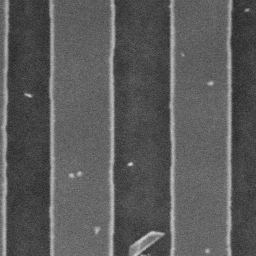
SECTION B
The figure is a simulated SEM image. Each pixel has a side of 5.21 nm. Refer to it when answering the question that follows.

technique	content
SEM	lines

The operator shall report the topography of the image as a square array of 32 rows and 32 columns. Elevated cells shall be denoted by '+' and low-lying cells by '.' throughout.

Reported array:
+.....++++++++.......++++++++...
+.....++++++++.......++++++++...
+.....++++++++.......++++++++...
+.....++++++++.......++++++++...
+.....++++++++.......++++++++...
+.....++++++++.......++++++++...
+.....++++++++.......++++++++...
+.....++++++++.......++++++++...
+.....++++++++.......++++++++...
+.....++++++++.......++++++++...
+.....++++++++.......++++++++...
+.....++++++++.......++++++++...
+.....++++++++.......++++++++...
+.....++++++++.......++++++++...
+.....++++++++.......++++++++...
+.....++++++++.......++++++++...
+.....++++++++.......++++++++...
+.....++++++++.......++++++++...
+.....++++++++.......++++++++...
+.....++++++++.......++++++++...
+.....++++++++.......++++++++...
+.....++++++++.......++++++++...
+.....++++++++.......++++++++...
+.....++++++++.......++++++++...
+.....++++++++.......++++++++...
+.....++++++++.......++++++++...
+.....++++++++.......++++++++...
+.....++++++++.......++++++++...
+.....++++++++.......++++++++...
+.....++++++++.......++++++++...
+.....++++++++.......++++++++...
+.....++++++++.......++++++++...